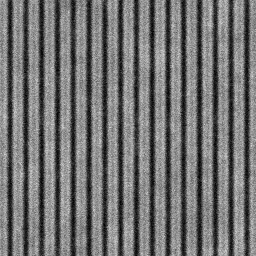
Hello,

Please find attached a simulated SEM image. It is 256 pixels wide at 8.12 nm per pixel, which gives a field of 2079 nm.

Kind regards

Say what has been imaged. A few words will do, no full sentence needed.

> parallel lines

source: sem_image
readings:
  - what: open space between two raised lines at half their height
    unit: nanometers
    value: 53.8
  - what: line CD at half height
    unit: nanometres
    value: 76.1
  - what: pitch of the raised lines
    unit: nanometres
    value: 128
